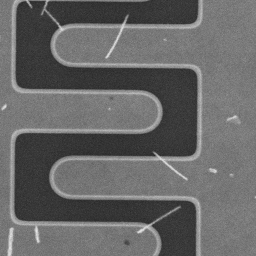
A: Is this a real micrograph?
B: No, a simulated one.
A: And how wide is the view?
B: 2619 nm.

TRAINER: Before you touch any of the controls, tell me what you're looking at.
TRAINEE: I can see groups of lines, slits or small figures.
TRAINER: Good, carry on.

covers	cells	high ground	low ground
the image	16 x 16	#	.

#............###
#...........####
#..#############
#...############
#...........####
#...........####
##########..####
##########..####
#...........####
#...........####
#..#############
#..#############
#...........####
#...........####
##########..####
##########..####